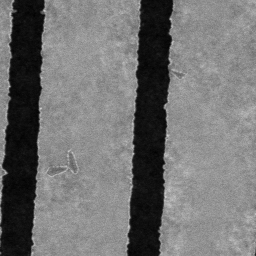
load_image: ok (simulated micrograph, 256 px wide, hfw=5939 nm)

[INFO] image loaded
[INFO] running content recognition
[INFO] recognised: one or a few lines or trenches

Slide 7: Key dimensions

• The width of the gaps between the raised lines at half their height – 2170 nanometers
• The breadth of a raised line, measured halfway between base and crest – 788 nm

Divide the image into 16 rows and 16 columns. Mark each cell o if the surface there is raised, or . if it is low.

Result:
.oo......oo.....
.oo......oo.....
.oo......oo.....
.oo......oo.....
.oo.....ooo.....
.oo......oo.....
oo......oo......
ooo.....oo......
oo......oo......
oo......oo......
oo......oo......
oo......oo......
oo......oo......
oo......oo......
oo......oo......
oo......oo......